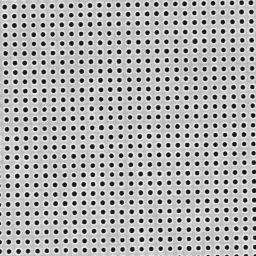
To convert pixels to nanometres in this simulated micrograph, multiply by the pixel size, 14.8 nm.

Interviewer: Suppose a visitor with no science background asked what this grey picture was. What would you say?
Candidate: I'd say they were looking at a regular array of holes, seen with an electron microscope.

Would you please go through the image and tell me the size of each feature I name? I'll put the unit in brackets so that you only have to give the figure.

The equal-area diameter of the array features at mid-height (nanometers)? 73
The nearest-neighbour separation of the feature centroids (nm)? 136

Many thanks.